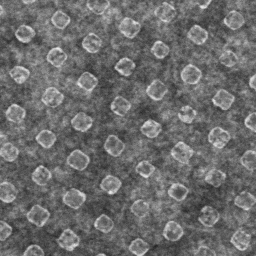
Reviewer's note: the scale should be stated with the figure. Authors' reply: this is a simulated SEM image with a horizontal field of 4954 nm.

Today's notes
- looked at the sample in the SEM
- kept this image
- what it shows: a regular array of raised bodies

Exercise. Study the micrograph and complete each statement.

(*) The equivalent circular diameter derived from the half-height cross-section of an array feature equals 348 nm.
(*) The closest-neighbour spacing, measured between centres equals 743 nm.